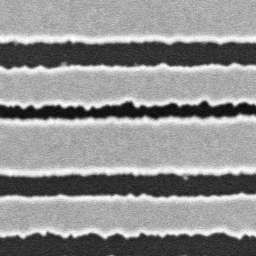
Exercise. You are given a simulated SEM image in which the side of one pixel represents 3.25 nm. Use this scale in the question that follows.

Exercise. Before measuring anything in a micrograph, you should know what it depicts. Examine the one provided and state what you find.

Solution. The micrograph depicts lines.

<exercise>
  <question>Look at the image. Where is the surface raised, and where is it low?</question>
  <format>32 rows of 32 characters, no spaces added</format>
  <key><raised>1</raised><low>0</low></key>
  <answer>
11111111111111111111111111111111
11111111111111111111111111111111
11111111111111111111111111111111
11111111111111111111111111111111
11111111111111111111111111111111
00000000000000000000000000000000
00000000000000000000000000000000
00000000000000000000000000000000
00101101111111111111111111111111
11111111111111111111111111111111
11111111111111111111111111111111
11111111111111111111111111111111
11111111111111111111111111111111
00001000001000000000000000000000
00000000000000000000000000000111
11111111111111111111111111111111
11111111111111111111111111111111
11111111111111111111111111111111
11111111111111111111111111111111
11111111111111111111111111111111
11111111111111111111111111111111
11111111111111111111111111111111
00000000000000000000000000000000
00000000000000000000000000000000
11100001001111111110010000111111
11111111111111111111111111111111
11111111111111111111111111111111
11111111111111111111111111111111
11111111111111111111111111111111
11100000010001011000000000000101
00000000000000000000000000000000
00000000000000000000000000000000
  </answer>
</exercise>